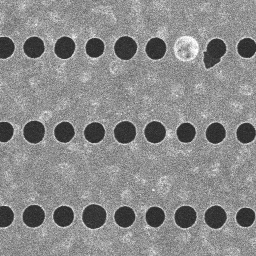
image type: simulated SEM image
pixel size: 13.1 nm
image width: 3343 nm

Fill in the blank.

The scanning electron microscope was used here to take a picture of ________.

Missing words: a regular array of holes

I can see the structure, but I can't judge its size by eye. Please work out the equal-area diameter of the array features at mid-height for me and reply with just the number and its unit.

283 nanometers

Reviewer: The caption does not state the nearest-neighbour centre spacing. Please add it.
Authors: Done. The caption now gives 0.394 um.